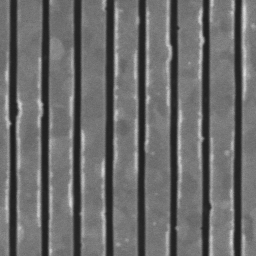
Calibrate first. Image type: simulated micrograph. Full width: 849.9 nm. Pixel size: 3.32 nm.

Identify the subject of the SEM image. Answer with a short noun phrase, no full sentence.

parallel lines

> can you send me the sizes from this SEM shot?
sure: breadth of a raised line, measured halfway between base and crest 81.3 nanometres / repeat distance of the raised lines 0.107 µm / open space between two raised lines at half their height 25.3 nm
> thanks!